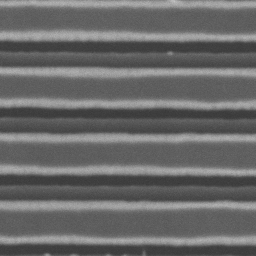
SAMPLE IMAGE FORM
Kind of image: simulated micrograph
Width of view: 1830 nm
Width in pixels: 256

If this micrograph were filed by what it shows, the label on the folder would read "lines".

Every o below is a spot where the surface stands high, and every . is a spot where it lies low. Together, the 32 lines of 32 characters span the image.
oooooooooooooooooooooooooooooooo
oooooooooooooooooooooooooooooooo
oooooooooooooooooooooooooooooooo
oooooooooooooooooooooooooooooooo
oooooooooooooooooooooooooooooooo
................................
................................
................................
................................
oooooooooooooooooooooooooooooooo
oooooooooooooooooooooooooooooooo
oooooooooooooooooooooooooooooooo
oooooooooooooooooooooooooooooooo
.........................oo.....
................................
................................
................................
oooooooooooooooooooooooooooooooo
oooooooooooooooooooooooooooooooo
oooooooooooooooooooooooooooooooo
oooooooooooooooooooooooooooooooo
oooooooooooooooooooooooooooooooo
................................
................................
................................
oooooooooooooooooooooooooooooooo
oooooooooooooooooooooooooooooooo
oooooooooooooooooooooooooooooooo
oooooooooooooooooooooooooooooooo
oooooooooooooooooooooooooooooooo
................................
................................